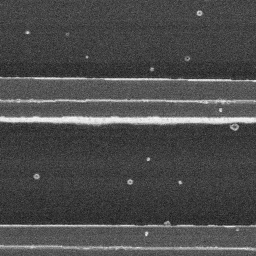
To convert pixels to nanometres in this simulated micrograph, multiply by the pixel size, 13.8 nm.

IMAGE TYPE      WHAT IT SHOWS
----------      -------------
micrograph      lines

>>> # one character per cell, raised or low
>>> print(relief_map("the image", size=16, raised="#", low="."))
................
................
................
................
................
################
################
................
................
................
................
................
................
................
################
################